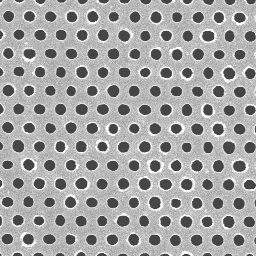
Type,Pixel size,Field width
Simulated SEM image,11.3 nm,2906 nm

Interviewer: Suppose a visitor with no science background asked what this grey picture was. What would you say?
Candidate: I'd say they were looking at a regular array of holes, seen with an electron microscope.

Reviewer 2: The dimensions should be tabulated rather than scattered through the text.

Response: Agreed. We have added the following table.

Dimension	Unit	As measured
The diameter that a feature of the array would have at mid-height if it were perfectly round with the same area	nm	127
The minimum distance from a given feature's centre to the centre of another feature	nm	235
